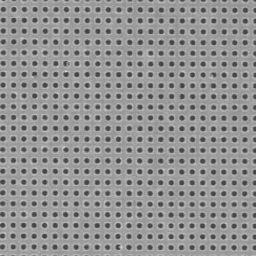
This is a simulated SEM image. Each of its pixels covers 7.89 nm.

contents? a regular array of holes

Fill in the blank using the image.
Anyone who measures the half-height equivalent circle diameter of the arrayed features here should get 46.3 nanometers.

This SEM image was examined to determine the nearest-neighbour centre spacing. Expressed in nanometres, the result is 82.2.